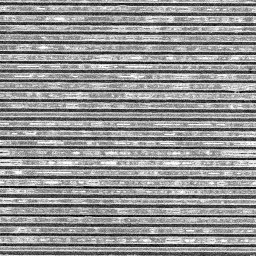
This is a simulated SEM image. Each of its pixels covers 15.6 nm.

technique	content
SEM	parallel lines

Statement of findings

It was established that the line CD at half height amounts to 107 nm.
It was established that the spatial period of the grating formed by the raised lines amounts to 150 nm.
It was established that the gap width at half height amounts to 3 pixels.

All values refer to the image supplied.